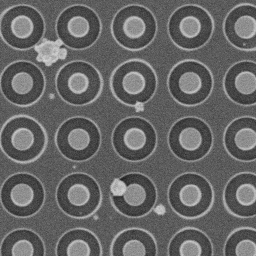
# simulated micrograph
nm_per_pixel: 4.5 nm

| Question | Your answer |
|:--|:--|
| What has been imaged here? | an array of small figures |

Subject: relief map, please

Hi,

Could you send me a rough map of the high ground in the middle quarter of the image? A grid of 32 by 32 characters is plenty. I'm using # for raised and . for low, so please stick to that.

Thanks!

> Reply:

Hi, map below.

.......#######.......#######....
........#####.........#####.....
.........###....###....###....##
..###....###...####....###...###
..####...###...#####...###...###
..####...###...#####...###...###
..###....###....###....###....##
.........####.........#####.....
........#####.........######....
#.....#########...#.#########...
################################
################################
################################
##...###########...###########..
.......#######.......#######....
........#####.........#####.....
..###...#####....##....####...##
.#####...###....####...###...###
.#####...###...#####...###...###
.#####...###...#####...###...###
..####...####...###....###....##
........#####.........#####.....
........######........######....
#.....#########.....#########...
################################
################################
################################
##...###########...###########..
.......#######.......#######....
........#######.......#####.....
........#######.###....####....#
..####...###########...###....##